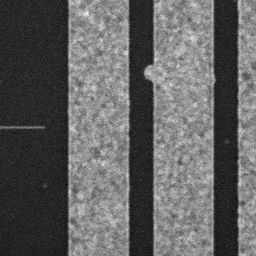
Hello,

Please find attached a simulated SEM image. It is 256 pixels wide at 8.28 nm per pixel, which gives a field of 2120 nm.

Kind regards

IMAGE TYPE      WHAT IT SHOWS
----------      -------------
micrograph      one or a few lines or trenches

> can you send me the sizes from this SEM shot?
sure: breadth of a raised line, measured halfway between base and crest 0.482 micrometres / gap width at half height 221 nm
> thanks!